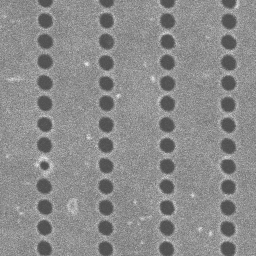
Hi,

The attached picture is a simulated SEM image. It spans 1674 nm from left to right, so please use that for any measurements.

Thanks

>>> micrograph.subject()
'a regular array of holes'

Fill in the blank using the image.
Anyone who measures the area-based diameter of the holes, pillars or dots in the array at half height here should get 103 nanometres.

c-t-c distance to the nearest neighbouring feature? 135 nanometres